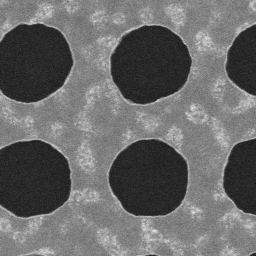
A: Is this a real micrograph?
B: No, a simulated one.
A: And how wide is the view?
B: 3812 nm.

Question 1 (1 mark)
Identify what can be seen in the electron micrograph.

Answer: holes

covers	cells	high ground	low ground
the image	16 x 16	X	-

XXXXXXXXXXXXXXXX
XXXXXXXXXXXXXXXX
----XXXX---XXXX-
----XXX-----XX--
----XXX-----XX--
----XXX----XXXX-
XXXXXXXXXXXXXXXX
XXXXXXXXXXXXXXXX
XXXXXXXXXXXXXXXX
----XXXX---XXX--
----XXX-----XX--
----XXX-----XX--
----XXX----XXX--
X-XXXXXXXXXXXXXX
XXXXXXXXXXXXXXXX
XXXXXXXXXXXXXXXX